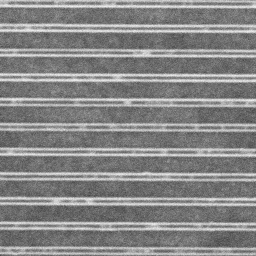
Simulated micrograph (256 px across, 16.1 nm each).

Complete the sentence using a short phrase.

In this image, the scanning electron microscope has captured parallel lines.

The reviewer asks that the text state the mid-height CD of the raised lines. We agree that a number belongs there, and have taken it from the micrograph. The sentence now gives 0.0967 micrometres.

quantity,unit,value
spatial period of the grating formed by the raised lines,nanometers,398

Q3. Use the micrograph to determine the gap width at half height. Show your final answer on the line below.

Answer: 300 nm